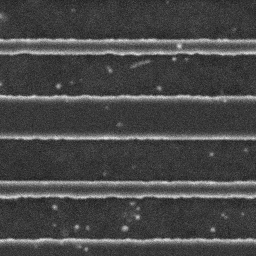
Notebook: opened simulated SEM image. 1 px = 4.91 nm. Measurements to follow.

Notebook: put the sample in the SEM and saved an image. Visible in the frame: lines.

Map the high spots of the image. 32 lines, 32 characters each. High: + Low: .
................................
................................
................................
................................
................................
++++++++++++++++++++++++++++++++
++++++++++++++++++++++++++++++++
................................
................................
................................
................................
................................
++++++++++++++++++++++++++++++++
++++++++++++++++++++++++++++++++
++++++++++++++++++++++++++++++++
++++++++++++++++++++++++++++++++
++++++++++++++++++++++++++++++++
................................
................................
................................
................................
................................
................................
++++++++++++++++++++++++++++++++
++++++++++++++++++++++++++++++++
................................
................................
................................
................................
................................
++++++++++++++++++++++++++++++++
++++++++++++++++++++++++++++++++